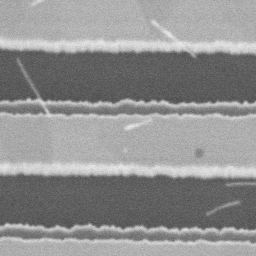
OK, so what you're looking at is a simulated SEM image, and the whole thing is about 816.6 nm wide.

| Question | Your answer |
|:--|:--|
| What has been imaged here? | lines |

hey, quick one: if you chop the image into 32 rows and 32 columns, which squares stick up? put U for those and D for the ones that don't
UUUUUUUUUUUUUUUUUUUUUUUUUUUUUUUU
UUUUUUUUUUUUUUUUUUUUUUUUUUUUUUUU
UUUUUUUUUUUUUUUUUUUUUUUUUUUUUUUU
UUUUUUUUUUUUUUUUUUUUUUUUUUUUUUUU
UUUUUUUUUUUUUUUUUUUUUUUUUUUUUUUU
UUUUUUUUUUUUUUUUUUUUUUUUUUUUUUUU
DDDDDDDDDDDDDDDDDDDDDDDDDDDDDDDD
DDDDDDDDDDDDDDDDDDDDDDDDDDDDDDDD
DDDDDDDDDDDDDDDDDDDDDDDDDDDDDDDD
DDDDDDDDDDDDDDDDDDDDDDDDDDDDDDDD
DDDDDDDDDDDDDDDDDDDDDDDDDDDDDDDD
DDDDDDDDDDDDDDDDDDDDDDDDDDDDDDDD
DDDDDDDDDDDDDDDDDDDDDDDDDDDDDDDD
UUUUUUUUUUUUUUUUUUUUUUUUUUUUUUUU
UUUUUUUUUUUUUUUUUUUUUUUUUUUUUUUU
UUUUUUUUUUUUUUUUUUUUUUUUUUUUUUUU
UUUUUUUUUUUUUUUUUUUUUUUUUUUUUUUU
UUUUUUUUUUUUUUUUUUUUUUUUUUUUUUUU
UUUUUUUUUUUUUUUUUUUUUUUUUUUUUUUU
UUUUUUUUUUUUUUUUUUUUUUUUUUUUUUUU
UUUUUUUUUUUUUUUUUUUUUUUUUUUUUUUU
DDDDDDDDDDDDDDDDDDDDDUUUDUUDUUUU
DDDDDDDDDDDDDDDDDDDDDDDDDDDDDDDD
DDDDDDDDDDDDDDDDDDDDDDDDDDDDDDDD
DDDDDDDDDDDDDDDDDDDDDDDDDDDDDDDD
DDDDDDDDDDDDDDDDDDDDDDDDDDDDDDDD
DDDDDDDDDDDDDDDDDDDDDDDDDDDDDDDD
DDDDDDDDDDDDDDDDDDDDDDDDDDDDDDDD
UUUUUUDUDUUUUUUDUUDDDDDDDDDDDDDD
UUUUUUUUUUUUUUUUUUUUUUUUUUUUUUUU
UUUUUUUUUUUUUUUUUUUUUUUUUUUUUUUU
UUUUUUUUUUUUUUUUUUUUUUUUUUUUUUUU